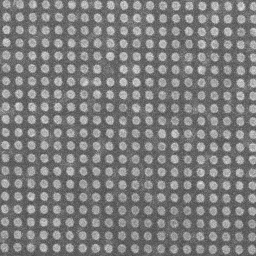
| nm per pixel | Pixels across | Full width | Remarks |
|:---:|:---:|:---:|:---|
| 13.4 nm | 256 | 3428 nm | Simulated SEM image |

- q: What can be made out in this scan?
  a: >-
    a regular array of raised bodies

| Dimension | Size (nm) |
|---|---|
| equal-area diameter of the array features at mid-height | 95.6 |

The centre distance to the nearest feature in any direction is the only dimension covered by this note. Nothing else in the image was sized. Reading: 170 nanometers